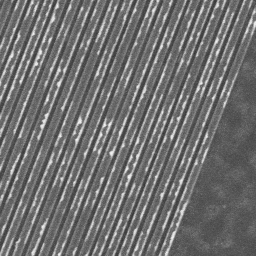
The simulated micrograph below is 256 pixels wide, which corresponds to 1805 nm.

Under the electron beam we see parallel lines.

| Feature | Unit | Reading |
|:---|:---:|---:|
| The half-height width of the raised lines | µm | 0.06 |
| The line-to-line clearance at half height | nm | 29.5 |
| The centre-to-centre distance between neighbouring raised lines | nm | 87.4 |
